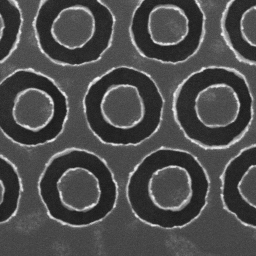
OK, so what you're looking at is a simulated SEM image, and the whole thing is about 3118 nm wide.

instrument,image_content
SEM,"ring-shaped grooves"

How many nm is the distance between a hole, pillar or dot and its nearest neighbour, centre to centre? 1080